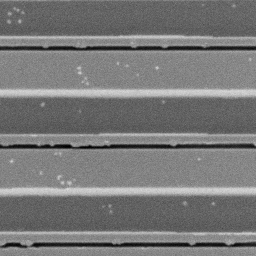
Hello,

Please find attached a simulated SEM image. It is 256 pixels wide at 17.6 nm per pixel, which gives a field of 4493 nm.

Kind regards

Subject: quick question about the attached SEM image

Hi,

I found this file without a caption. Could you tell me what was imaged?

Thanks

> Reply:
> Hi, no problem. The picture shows lines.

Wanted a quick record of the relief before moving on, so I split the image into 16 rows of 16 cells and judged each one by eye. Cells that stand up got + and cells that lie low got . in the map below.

................
................
++++++++++++++++
++++++++++++++++
++++++++++++++++
++++++++++++++++
................
................
++++++++++++++++
++++++++++++++++
++++++++++++++++
++++++++++++++++
................
................
................
++++++++++++++++